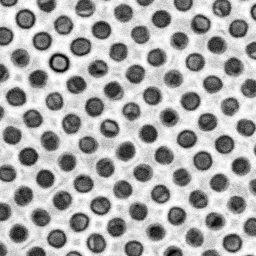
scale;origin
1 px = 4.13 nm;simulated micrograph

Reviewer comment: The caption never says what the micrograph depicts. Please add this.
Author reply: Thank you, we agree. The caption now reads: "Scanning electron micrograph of a regular array of holes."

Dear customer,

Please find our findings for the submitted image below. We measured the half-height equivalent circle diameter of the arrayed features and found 84.6 nm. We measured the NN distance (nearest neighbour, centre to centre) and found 110 nm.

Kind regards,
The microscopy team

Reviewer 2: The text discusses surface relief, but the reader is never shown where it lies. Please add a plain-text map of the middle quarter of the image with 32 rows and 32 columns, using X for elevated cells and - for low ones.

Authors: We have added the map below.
-XXXXX-----XXXXX---XXX---XXXXX--
-XXXXX-----XXXX-----XXXXXX---XX-
XXXXXX-----XXXX------XXXX-----XX
X----XX--XXXXXX-----XXXXX-----XX
X-----XXXXXX--XX----XXXXX-----XX
X-----XXXX----XXXXXXX--XXX---XXX
X----XXXXX-----XXXXX----XXXXXXXX
XX--XXXXXX-----XXXXX-----XXXXX--
XXXXXXX-XXX----XXXXX-----XXXX---
XXXXX-----XXXXXX--XX----XXXXX---
XXXXX-----XXXXX----XXXXXXXXXX---
XXXXX-----XXXX-----XXXXX----XX--
X--XXX---XXXXX-----XXXXX-----XXX
----XXXXXXXXXXX----XXXXX-----XXX
----XXXXX----XXXXXXXXXXX-----XXX
----XXXXX-----XXXXX---XXX---XXXX
----XXXXX-----XXXXX----XXXXXXX--
X-XXXXXXX-----XXXX------XXXX----
XXXX----XX---XXXXXX----XXXXX----
XXXX-----XXXXXX--XX----XXXXX----
XXX------XXXX-----XXXXXX--XXX---
XXXX----XXXXX-----XXXXX----XXXXX
--XXX---XXXXX-----XXXX-----XXXXX
---XXXXXX--XX----XXXXXX-----XXXX
---XXXXX-----XX-XXXXXXX----XXXXX
---XXXXX-----XXXXX----XXXXXXXXXX
--XXXXXX-----XXXX-----XXXXX----X
XXXX--XX-----XXXX-----XXXXX-----
XXX----XXX-XXXXXXX----XXXXX-----
XX------XXXXX---XXX--XXXXXX-----
XX------XXXX-----XXXXXX---XX---X
XXX----XXXXX-----XXXXX-----XXXXX